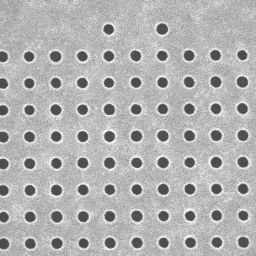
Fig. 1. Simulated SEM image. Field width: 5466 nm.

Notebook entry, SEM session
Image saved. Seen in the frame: a regular array of holes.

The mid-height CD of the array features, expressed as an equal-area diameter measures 237 nm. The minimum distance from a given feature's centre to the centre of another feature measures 565 nanometres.